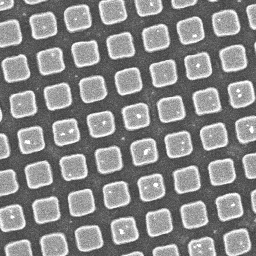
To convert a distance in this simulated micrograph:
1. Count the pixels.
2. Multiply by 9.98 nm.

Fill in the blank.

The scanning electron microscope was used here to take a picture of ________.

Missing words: a regular array of raised bodies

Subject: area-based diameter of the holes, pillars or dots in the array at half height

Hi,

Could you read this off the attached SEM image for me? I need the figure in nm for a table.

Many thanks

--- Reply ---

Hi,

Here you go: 274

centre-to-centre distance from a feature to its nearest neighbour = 0.355 micrometres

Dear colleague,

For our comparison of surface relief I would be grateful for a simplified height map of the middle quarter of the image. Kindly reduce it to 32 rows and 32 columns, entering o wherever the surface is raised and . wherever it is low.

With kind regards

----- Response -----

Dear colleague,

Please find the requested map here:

....o.................oooooo..oo
...............oooo...oooooo...o
.............oooooo...oooooo...o
.....ooooo...oooooo...oooooo...o
....oooooo...oooooo...oooooo....
o...oooooo...ooooooo...oo.......
o...ooooooo..oooooo.............
oo..ooooooo...oo................
oo..oooooo................ooo...
oo...oo.................oooooo..
o................oooo..ooooooo..
...............oooooo...oooooo..
.......ooooo...oooooo...oooooo..
......oooooo...oooooo...oooooo..
ooo...ooooooo..oooooo....o......
ooo...ooooooo..oooooo...........
oooo..ooooooo...................
oooo...ooooo...............oooo.
oooo.....................ooooooo
ooo...............ooooo..ooooooo
.................oooooo...oooooo
........oooooo...oooooo...oooooo
........oooooo...oooooo...ooooo.
ooooo...oooooo...oooooo.........
ooooo...oooooo...oooooo.........
ooooo...oooooo..................
oooooo...ooooo...............ooo
oooooo.....................ooooo
ooooo..............oooooo...oooo
..............o....oooooo...oooo
..........oooooo...oooooo...oooo
.....o....oooooo...oooooo...oooo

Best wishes